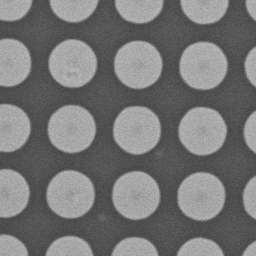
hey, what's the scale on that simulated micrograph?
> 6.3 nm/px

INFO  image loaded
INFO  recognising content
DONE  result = an array of small figures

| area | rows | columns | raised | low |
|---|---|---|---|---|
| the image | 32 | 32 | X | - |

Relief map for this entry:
XXXX--XXXXXX--XXXXXX---XXXXX---X
XXX----XXXXX---XXXXX---XXXXX---X
XX------XX------XXX-----XXX-----
--------------------------------
--------------------------------
XXX-----XXX-----XXX-----XXX-----
XXXX---XXXXX---XXXXX---XXXXX---X
XXXX--XXXXXX--XXXXXX---XXXXX---X
XXXX--XXXXXX--XXXXXX--XXXXXX---X
XXX----XXXXX---XXXXX---XXXXX---X
XX------XXX-----XXX----XXXX-----
--------------------------------
--------------------------------
XX------XX------XX------XX------
XXX----XXXX----XXXXX---XXXXX---X
XXXX--XXXXXX--XXXXXX--XXXXXX---X
XXXX--XXXXXX--XXXXXX--XXXXXX---X
XXX---XXXXXX--XXXXXX---XXXXX---X
XX-----XXXX----XXXX----XXXX----X
--------------------------------
--------------------------------
XX------XX------X---------------
XXX----XXXX----XXXX----XXXX----X
XXXX--XXXXXX--XXXXXX--XXXXXX---X
XXXX--XXXXXX--XXXXXX--XXXXXX--XX
XXX---XXXXXX--XXXXXX--XXXXXX--XX
XXX----XXXX----XXXX----XXXX----X
-------------------------X------
--------------------------------
X-------------------------------
XXX----XXXX----XXXX----XXXX----X
XXX---XXXXX---XXXXXX--XXXXXX---X